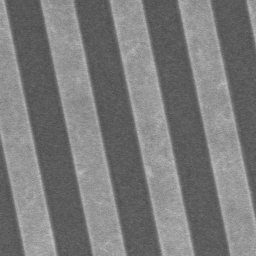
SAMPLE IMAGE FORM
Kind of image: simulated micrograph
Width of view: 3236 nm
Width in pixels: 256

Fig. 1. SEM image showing one or a few lines or trenches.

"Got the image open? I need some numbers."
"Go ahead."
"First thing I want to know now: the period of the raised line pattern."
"848 nm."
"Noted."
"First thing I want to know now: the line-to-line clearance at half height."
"0.449 µm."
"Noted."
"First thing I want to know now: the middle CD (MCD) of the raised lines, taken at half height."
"405 nm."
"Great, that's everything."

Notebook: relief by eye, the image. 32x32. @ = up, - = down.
@----@@@@-----@@@@----@@@@-----@
@----@@@@-----@@@@----@@@@@----@
@-----@@@@----@@@@-----@@@@----@
@-----@@@@----@@@@-----@@@@-----
@-----@@@@-----@@@@----@@@@-----
@@----@@@@-----@@@@----@@@@-----
@@----@@@@-----@@@@-----@@@@----
@@-----@@@@----@@@@-----@@@@----
@@-----@@@@----@@@@-----@@@@----
@@-----@@@@-----@@@@----@@@@----
@@@----@@@@-----@@@@----@@@@----
@@@----@@@@-----@@@@-----@@@@---
@@@-----@@@@----@@@@-----@@@@---
@@@-----@@@@----@@@@-----@@@@---
@@@-----@@@@-----@@@@----@@@@---
@@@@----@@@@-----@@@@----@@@@---
@@@@----@@@@@----@@@@-----@@@@--
@@@@-----@@@@----@@@@-----@@@@--
@@@@-----@@@@----@@@@-----@@@@--
-@@@@----@@@@-----@@@@----@@@@--
-@@@@----@@@@-----@@@@----@@@@--
-@@@@----@@@@@----@@@@-----@@@@-
-@@@@-----@@@@----@@@@-----@@@@-
-@@@@-----@@@@-----@@@-----@@@@-
--@@@@----@@@@-----@@@@----@@@@-
--@@@@----@@@@-----@@@@----@@@@@
--@@@@----@@@@@----@@@@-----@@@@
--@@@@-----@@@@----@@@@-----@@@@
--@@@@-----@@@@-----@@@@----@@@@
---@@@@----@@@@-----@@@@----@@@@
---@@@@----@@@@-----@@@@----@@@@
---@@@@-----@@@@----@@@@-----@@@